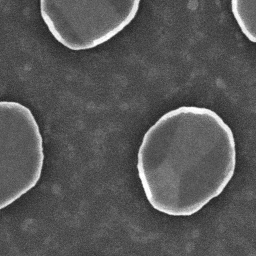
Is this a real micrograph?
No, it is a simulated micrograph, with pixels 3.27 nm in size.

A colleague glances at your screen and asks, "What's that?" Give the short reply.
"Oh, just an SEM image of raised bodies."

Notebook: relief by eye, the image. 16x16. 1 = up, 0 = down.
0001111110000001
0001111100000001
0000111000000000
0000000000000000
0000000000000000
0000000000000000
1000000000000000
1100000000111100
1110000001111110
1110000001111110
1110000001111110
1100000001111100
1000000001111000
0000000000000000
0000000000000000
0000000000000000